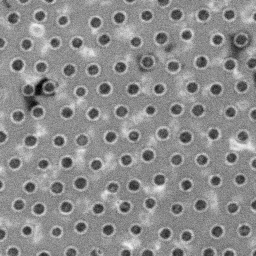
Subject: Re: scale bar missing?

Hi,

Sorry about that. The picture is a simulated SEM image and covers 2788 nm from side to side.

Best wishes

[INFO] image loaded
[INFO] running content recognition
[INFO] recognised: a regular array of raised bodies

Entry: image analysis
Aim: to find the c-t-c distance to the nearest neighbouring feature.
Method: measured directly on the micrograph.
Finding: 254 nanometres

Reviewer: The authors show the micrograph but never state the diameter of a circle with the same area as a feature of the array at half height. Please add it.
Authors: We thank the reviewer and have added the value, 12.9 pixels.